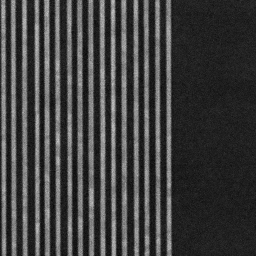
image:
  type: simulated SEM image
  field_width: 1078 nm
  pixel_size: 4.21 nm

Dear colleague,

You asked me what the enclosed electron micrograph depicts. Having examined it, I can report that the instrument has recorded parallel lines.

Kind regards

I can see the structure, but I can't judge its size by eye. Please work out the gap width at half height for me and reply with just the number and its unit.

31 nanometres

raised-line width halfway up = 15.3 nanometers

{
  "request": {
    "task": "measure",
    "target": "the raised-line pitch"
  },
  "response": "46.3 nm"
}